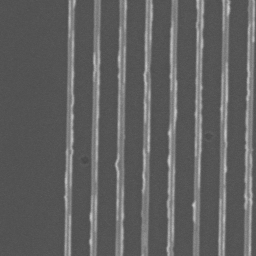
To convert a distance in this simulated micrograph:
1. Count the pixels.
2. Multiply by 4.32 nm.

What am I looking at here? parallel lines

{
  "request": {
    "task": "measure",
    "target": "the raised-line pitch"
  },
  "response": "111 nm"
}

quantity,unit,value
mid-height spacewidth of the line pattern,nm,85.4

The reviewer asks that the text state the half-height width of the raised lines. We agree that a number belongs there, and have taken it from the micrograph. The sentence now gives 28.6 nm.